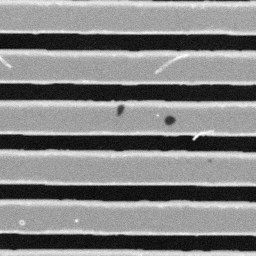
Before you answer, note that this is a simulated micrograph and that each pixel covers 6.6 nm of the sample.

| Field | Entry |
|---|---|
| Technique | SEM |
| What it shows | lines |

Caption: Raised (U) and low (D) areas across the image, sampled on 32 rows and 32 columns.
UUUUUUUUUUUUUUUUUUUUUUUUUUUUUUUU
UUUUUUUUUUUUUUUUUUUUUUUUUUUUUUUU
UUUUUUUUUUUUUUUUUUUUUUUUUUUUUUUU
UUUUUUUUUUUUUUUUUUUUUUUUUUUUUUUU
DDDDDDDDDDDDDDDDDDDDDDDDDDDDDDDD
DDDDDDDDDDDDDDDDDDDDDDDDDDDDDDDD
UUUUUUUUUUUUUUUUUUUUUUUUUUUUUUUU
UUUUUUUUUUUUUUUUUUUUUUUUUUUUUUUU
UUUUUUUUUUUUUUUUUUUUUUUUUUUUUUUU
UUUUUUUUUUUUUUUUUUUUUUUUUUUUUUUU
DDDDDDDDDDDDDDDDDDDDDDDDDDDDDDDD
DDDDDDDDDDDDDDDDDDDDDDDDDDDDDDDD
DDDDDDDDDDDDDDDDDDDDDDDDDDDDDDDD
UUUUUUUUUUUUUUUUUUUUUUUUUUUUUUUU
UUUUUUUUUUUUUUUUUUUUUUUUUUUUUUUU
UUUUUUUUUUUUUUUUUUUUUUUUUUUUUUUU
UUUUUUUUUUUUUUUUUUUUUUUUUUUUUUUU
DDDDDDDDDDDDDDDDDDDDDDDDDDDDDDDD
DDDDDDDDDDDDDDDDDDDDDDDDDDDDDDDD
UUUUUUUUUUUUUUUUUUUUUUUUUUUUUUUU
UUUUUUUUUUUUUUUUUUUUUUUUUUUUUUUU
UUUUUUUUUUUUUUUUUUUUUUUUUUUUUUUU
UUUUUUUUUUUUUUUUUUUUUUUUUUUUUUUU
DDDDDDDDDDDDDDDDDDDDDDDDDDDDDDDD
DDDDDDDDDDDDDDDDDDDDDDDDDDDDDDDD
UUUUUUUUUUUUUUUUUUUUUUUUUUUUUUUU
UUUUUUUUUUUUUUUUUUUUUUUUUUUUUUUU
UUUUUUUUUUUUUUUUUUUUUUUUUUUUUUUU
UUUUUUUUUUUUUUUUUUUUUUUUUUUUUUUU
DDDDDDDDDDDDDDDDDDDDDDDDDDDDDDDD
DDDDDDDDDDDDDDDDDDDDDDDDDDDDDDDD
UUUUUUUUUUUUUUUUUUUUUUUUUUUUUUDD